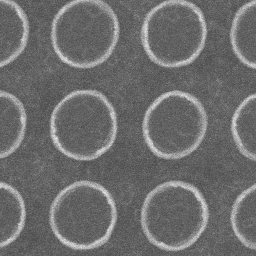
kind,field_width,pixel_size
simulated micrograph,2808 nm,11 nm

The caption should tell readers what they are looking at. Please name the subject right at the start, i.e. raised bodies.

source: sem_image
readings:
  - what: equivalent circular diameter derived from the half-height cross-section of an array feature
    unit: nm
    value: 697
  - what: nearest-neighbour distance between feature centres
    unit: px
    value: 90.8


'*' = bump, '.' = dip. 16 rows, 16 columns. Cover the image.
*...***...**...*
**.****..****..*
**.****..****..*
*...***...**...*
................
................
*...***...**...*
*..****..****..*
*..****..****..*
*...**....**...*
................
.....*..........
*...***..****..*
*..****..****..*
*...***..***...*
................